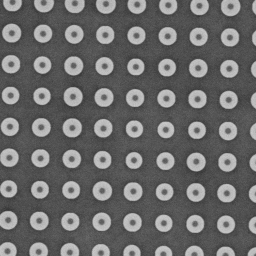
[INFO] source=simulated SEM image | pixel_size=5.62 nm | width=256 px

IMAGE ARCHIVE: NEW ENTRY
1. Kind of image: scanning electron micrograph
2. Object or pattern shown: an array of small figures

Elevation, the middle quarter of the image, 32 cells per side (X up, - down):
XXXXX---XXXX----XXXX----XXXX---X
XXXX----XXXX----XXXX----XXXX---X
-XXX-----XX------XX-----XXX-----
--------------------------------
--------------------------------
--------------------------------
-XXX-----XX------XX------X------
XXXX----XXXX----XXXX----XXXX----
XXXXX---XXXX----XXXX---XXXXX---X
XXXX----XXXX----XXXX----XXXX---X
--X------XX------XX-----XXX-----
--------------------------------
--------------------------------
--------------------------------
XXXX----XXXX----XXX-------------
XXXX----XXXX----XXXX----XXX----X
XXXX----XXXX----XXXX---XXXX----X
XXXX----XXXX----XXX-----XXX----X
--------------------------------
--------------------------------
--------------------------------
-X------------------------------
XXXX----XXX-----XXX-----XXX-----
XXXX----XXXX----XXX----XXXX----X
XXXX----XXXX----XXX----XXXXX---X
XXX-----XXX-----XXX-----XXX----X
--------------------------------
--------------------------------
--------------------------------
-X-------X----------------------
XXXX----XXXX---XXXX-----XXX----X
XXXX---XXXXX---XXXXX---XXXX----X